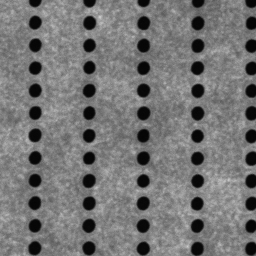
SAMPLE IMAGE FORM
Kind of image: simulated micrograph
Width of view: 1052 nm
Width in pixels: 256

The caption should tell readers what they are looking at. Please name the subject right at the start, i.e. a regular array of holes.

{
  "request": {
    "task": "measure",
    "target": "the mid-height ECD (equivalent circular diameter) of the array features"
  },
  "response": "55 nm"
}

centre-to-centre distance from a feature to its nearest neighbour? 0.0917 microns